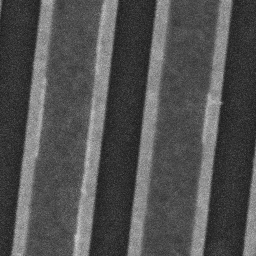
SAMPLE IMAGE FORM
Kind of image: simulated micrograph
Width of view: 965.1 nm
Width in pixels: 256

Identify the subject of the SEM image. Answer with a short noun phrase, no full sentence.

one or a few lines or trenches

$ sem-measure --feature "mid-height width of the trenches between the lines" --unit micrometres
0.188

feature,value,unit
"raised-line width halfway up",0.245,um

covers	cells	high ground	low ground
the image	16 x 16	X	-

---XXXX---XXXX--
---XXXX---XXXX--
---XXXX---XXXX--
---XXXX---XXXX--
--XXXXX---XXXX--
--XXXX----XXXX--
--XXXX---XXXX---
--XXXX---XXXX---
--XXXX---XXXX---
--XXXX---XXXX---
--XXXX---XXXX---
--XXXX---XXXX---
-XXXXX---XXXX---
-XXXX----XXXX---
-XXXX---XXXXX---
-XXXX---XXXX----